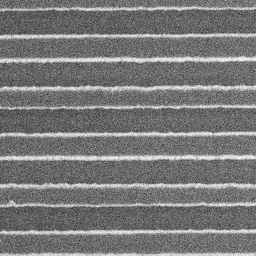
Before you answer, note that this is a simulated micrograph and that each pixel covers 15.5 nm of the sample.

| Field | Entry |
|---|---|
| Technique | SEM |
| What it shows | lines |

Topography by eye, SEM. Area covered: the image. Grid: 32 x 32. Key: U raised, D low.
UUUUUUUUUUUUUUUUUUUUUUUUUUUUUUUU
DDDDDDDDDDDDDDDDDDDDDDDDDDDDDDDD
DDDDDDDDDDDDDDDDDDDDDDDDDDDDDDDD
DDDDDDDDDDDDDDDDDDDDDDDDDDDDDDDD
DDDDDUUUUUUUUUUUUUUUUUUUUUUUUUUU
UUUUUUUUUUUUUUUUUUUUUUUUUUUUUUUU
UUUUUUUUUUUUUUUUUUUUUUUUUUUUUUUU
UUUUUUUUUUUUDUUDUUUUDDDDDUUUDDDD
DDDDDDDDDDDDDDDDDDDDDDDDDDDDDDDD
DDDDDDDDDDDDDDDDDDDDDDDDDDDDDDDD
DDDDDDDDDDDDDDDDDDDDDDDDDDDDDDDD
UUUUUUUUUUUUUUUUUUUUUUUUUUUUUUUU
UUUUUUUUUUUUUUUUUUUUUUUUUUUUUUUU
UUUUUUUUUUUUDUUUDDDDDDDDDDDDDDDD
DDDDDDDDDDDDDDDDDDDDDDDDDDDDDDDD
DDDDDDDDDDDDDDDDDDDDDDDDDDDDDDDD
DDDDDDDDDDDDDDDDDDDDDDDDDDDDDDDD
UUUUUUUUUUUUUUUUUUUUUUUUUUUUUUUU
UUUUUUUUUUUUUUUUUUUUUUUUUUUUUUUU
UUUUUUUUUUUUUUUUUUUUUUUUUUUUUUUU
DDDDDDDDDDDDDDDDDDDDDDDDDDDDDDDD
DDDDDDDDDDDDDDDDDDDDDDDDDDDDDDDD
DDDDDDDDDDDDDDDDDDDDDDDDDDDDDDDD
UUUUUUUUUUUUUUUUUUUUUUUUUUUUUUUU
UUUUUUUUUUUUUUUUUUUUUUUUUUUUUUUU
UUUUUUUUUUUUUUUUUUUUUUUUUUUUUUUU
DDDDDDDDDDDDDDDDDDDDDDDDDDDDDDDD
DDDDDDDDDDDDDDDDDDDDDDDDDDDDDDDD
DDDDDDDDDDDDDDDDDDDDDDDDDDDDDDDD
UUUUUUUUUUUUUUUUUUUUUUUUUUUUUUUU
UUUUUUUUUUUUUUUUUUUUUUUUUUUUUUUU
UUUUUUUUUUUUUUUUUUUUUUUUUUUUUUUU